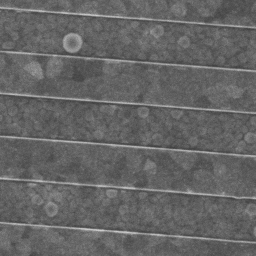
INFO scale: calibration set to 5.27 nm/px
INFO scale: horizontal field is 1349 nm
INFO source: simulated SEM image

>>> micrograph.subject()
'one or a few lines or trenches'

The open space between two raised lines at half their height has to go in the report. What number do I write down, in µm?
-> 0.225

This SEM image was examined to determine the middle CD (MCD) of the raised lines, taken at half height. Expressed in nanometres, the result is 224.